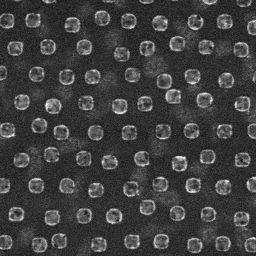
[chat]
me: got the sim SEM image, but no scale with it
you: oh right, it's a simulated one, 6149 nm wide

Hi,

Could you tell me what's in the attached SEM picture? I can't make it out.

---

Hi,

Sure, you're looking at a regular array of raised bodies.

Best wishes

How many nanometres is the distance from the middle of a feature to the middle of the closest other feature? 652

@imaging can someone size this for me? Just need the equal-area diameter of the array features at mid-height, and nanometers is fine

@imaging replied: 346